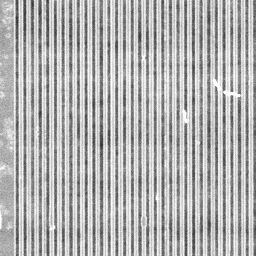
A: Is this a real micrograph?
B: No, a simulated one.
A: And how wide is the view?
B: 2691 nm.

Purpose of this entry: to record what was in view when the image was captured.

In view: parallel lines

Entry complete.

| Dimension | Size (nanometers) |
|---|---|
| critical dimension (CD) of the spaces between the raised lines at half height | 46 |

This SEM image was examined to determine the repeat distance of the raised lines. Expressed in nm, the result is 80.6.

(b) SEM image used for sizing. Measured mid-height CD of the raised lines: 0.0368 micrometres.